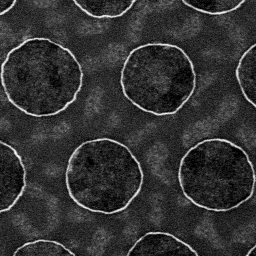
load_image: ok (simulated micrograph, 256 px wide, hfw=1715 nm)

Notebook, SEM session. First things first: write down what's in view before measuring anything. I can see raised bodies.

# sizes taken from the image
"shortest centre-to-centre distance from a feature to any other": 0.754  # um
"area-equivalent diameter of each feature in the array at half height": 492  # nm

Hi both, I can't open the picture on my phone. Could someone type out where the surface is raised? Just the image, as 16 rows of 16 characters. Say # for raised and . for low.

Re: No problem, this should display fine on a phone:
#....###....###.
................
..#.............
.####...####...#
#####...####...#
#####...####...#
.###....###.....
................
................
#....###....###.
#...#####..#####
#...#####..#####
#....###....###.
................
................
.###....####....